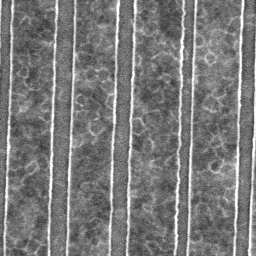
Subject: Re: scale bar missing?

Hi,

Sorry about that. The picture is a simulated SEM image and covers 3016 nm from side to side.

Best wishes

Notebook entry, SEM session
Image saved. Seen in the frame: one or a few lines or trenches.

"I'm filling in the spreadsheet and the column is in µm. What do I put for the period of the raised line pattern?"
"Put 0.725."